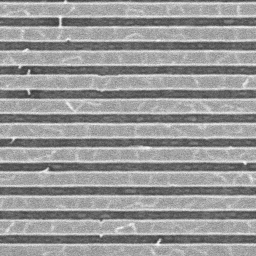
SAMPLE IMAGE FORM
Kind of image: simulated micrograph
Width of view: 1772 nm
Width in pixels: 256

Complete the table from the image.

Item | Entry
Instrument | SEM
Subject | parallel lines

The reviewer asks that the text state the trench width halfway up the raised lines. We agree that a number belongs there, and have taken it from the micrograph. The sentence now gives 65.7 nm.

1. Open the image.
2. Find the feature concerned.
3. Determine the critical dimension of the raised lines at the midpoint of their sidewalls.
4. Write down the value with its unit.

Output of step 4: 102 nm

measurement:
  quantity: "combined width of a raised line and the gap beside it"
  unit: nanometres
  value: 167